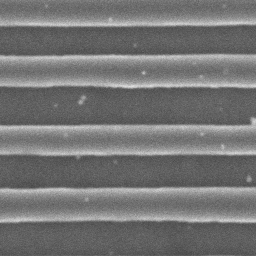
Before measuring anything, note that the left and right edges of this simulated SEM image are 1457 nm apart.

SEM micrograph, lines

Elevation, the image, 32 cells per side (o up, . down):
oooooooooooooooooooooooooooooooo
oooooooooooooooooooooooooooooooo
oooooooooooooooooooooooooooooooo
................................
................................
................................
................................
oooooooooooooooooooooooooooooooo
oooooooooooooooooooooooooooooooo
oooooooooooooooooooooooooooooooo
oooooooooooooooooooooooooooooooo
................................
................................
................................
................................
................................
oooooooooooooooooooooooooooooooo
oooooooooooooooooooooooooooooooo
oooooooooooooooooooooooooooooooo
................................
................................
................................
................................
................................
oooooooooooooooooooooooooooooooo
oooooooooooooooooooooooooooooooo
oooooooooooooooooooooooooooooooo
ooo....................ooooooooo
................................
................................
................................
................................